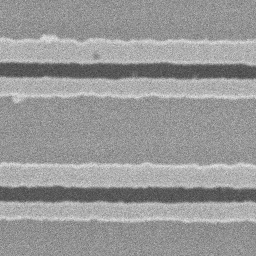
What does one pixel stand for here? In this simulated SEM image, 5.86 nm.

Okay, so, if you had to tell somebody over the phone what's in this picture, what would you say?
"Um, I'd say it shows lines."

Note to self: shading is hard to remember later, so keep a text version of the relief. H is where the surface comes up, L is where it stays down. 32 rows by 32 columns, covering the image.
LLLLLLLLLLLLLLLLLLLLLLLLLLLLLLLL
LLLLLLLLLLLLLLLLLLLLLLLLLLLLLLLL
LLLLLLLLLLLLLLLLLLLLLLLLLLLLLLLL
LLLLLLLLLLLLLLLLLLLLLLLLLLLLLLLL
LLLLLHHLLLLLLLLLLLLLLLLLLLLLLLLL
HHHHHHHHHHHHHHHHHHHHHHHHHHHHHHHH
HHHHHHHHHHHHHHHHHHHHHHHHHHHHHHHH
HHHHHHHHHHHHHHHHHHHHHHHHHHHHHHHH
LLLLLLLLLLLLLLLLLLLLLLLLLLLLLLLL
LLLLLLLLLLLLLLLLLLLLLLLLLLLLLLLL
HHHHHHHHHHHHHHHHHHHHHHHHHHHHHHHH
HHHHHHHHHHHHHHHHHHHHHHHHHHHHHHHH
LLLLLLLLLLLLLLLLLLLLLLLLLLLLLLLL
LLLLLLLLLLLLLLLLLLLLLLLLLLLLLLLL
LLLLLLLLLLLLLLLLLLLLLLLLLLLLLLLL
LLLLLLLLLLLLLLLLLLLLLLLLLLLLLLLL
LLLLLLLLLLLLLLLLLLLLLLLLLLLLLLLL
LLLLLLLLLLLLLLLLLLLLLLLLLLLLLLLL
LLLLLLLLLLLLLLLLLLLLLLLLLLLLLLLL
LLLLLLLLLLLLLLLLLLLLLLLLLLLLLLLL
HHLLLLLLLLLLLLLLLLHLLLLLLLLLLLHL
HHHHHHHHHHHHHHHHHHHHHHHHHHHHHHHH
HHHHHHHHHHHHHHHHHHHHHHHHHHHHHHHH
LLLLLLLLLLLLLLLLLLLLLLLLLLLLLHLL
LLLLLLLLLLLLLLLLLLLLLLLLLLLLLLLL
HHHHHHHHHHHHHHHHHHHHHLHHHHHHHHHH
HHHHHHHHHHHHHHHHHHHHHHHHHHHHHHHH
LLLLLLLHLLHLHHHHHHHLLHHHHHHHHHHH
LLLLLLLLLLLLLLLLLLLLLLLLLLLLLLLL
LLLLLLLLLLLLLLLLLLLLLLLLLLLLLLLL
LLLLLLLLLLLLLLLLLLLLLLLLLLLLLLLL
LLLLLLLLLLLLLLLLLLLLLLLLLLLLLLLL